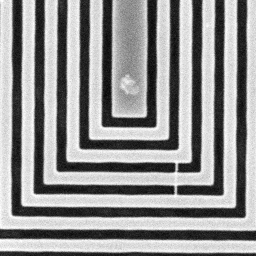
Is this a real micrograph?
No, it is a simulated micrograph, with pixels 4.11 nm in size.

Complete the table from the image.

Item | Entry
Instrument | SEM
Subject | groups of lines, slits or small figures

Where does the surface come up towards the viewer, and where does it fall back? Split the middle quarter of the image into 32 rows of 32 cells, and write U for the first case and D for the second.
DUUUDDUUUDDDUUUUUUUUUDDUUUDDDUUU
DUUUDDUUUDDDUUUUUUUUUDDUUUDDDUUU
DUUUDDUUUDDDUUUUUUUUUDDUUUDDDUUU
DUUUDDUUUDDDUUUUUUUUUDDUUUDDDUUU
DUUUDDUUUDDDUUUUUUUUUDDUUUDDDUUU
DUUUDDUUUDDDUUUUUUUUUDDUUUDDDUUU
DUUUDDUUUDDDUUUUUUUUUDDUUUDDDUUU
DUUUDDUUUDDDUUUUUUUUUDDUUUDDDUUU
DUUUDDUUUDDDUUUUUUUUDDDUUUDDDUUU
DUUUDDUUUDDDUUUUUUUUDDDUUUDDDUUU
DUUUDDUUUDDDUUUUUUUUUDDUUUDDDUUU
DUUUDDUUUDDDUUUUUUUUUDDUUUDDDUUU
DUUUDDUUUDDDUUUUUUUUUDDUUUDDDUUU
DUUUDDUUUDDDDDDDDDDDDDDUUUDDDUUU
DUUUDDUUUDDDDDDDDDDDDDDUUUDDDUUU
DUUUDDUUUDDDDDDDDDDDDDDUUUDDDUUU
DUUUDDUUUUUUUUUUUUUUUUUUUUDDDUUU
DUUUDDUUUUUUUUUUUUUUUUUUUUDDDUUU
DUUUDDDUUUUUUUUUUUUUUUUUUUDDDUUU
DUUUDDDDDDDDDDDDDDDDDDDDDDDDDUUU
DUUUDDDDDDDDDDDDDDDDDDDDDDDDDUUU
DUUUUDDUDDDDDDDDDDDDDDDDDDDDUUUU
DUUUUUUUUUUUUUUUUUUUUUUUUUUUUUUU
DUUUUUUUUUUUUUUUUUUUUUUUUUUUUUUU
DDDDDDDUUUDDDDUUUUUUDDUUUUUUUUUD
DDDDDDDDDDDDDDDDDDDDDDDDDDDDDDDD
DDDDDDDDDDDDDDDDDDDDDDDDDDDDDDDD
UUUUUUUUUUUUUUUUUUUUUUUUUUUUUUUU
UUUUUUUUUUUUUUUUUUUUUUUUUUUUUUUU
UUUUUUUUUUUUUUUUUUUUUUUUUUUUUUUU
DDDDDDDDDDDDDDDDDDDDDDDDDDDDDDDD
DDDDDDDDDDDDDDDDDDDDDDDDDDDDDDDD